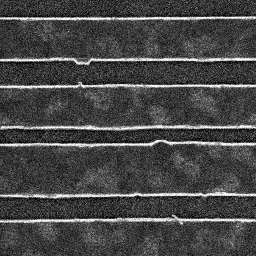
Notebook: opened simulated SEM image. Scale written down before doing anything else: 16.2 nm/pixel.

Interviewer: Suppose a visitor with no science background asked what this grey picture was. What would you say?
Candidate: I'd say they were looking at one or a few lines or trenches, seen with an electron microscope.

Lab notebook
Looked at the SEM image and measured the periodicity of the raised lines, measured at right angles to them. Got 1050 nanometres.